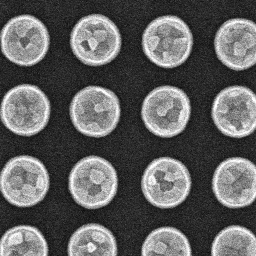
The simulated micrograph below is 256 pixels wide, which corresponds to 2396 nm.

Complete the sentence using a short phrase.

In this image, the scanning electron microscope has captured a regular array of raised bodies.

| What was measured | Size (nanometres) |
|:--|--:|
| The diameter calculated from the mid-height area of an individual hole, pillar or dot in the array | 451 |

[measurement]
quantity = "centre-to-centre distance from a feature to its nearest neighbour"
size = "653 nanometres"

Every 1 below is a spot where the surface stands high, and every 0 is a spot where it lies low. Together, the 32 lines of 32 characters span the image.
00000000000000000000000000000000
00000000000000000000000000000000
00111000001110000000110000000000
01111100011111000001111000001111
11111100011111100011111100011111
11111100011111100011111100011111
01111100011111100011111100011111
01111000001111000001111000001111
00000000000000000000000000000110
00000000000000000000000000000000
00000000000000000000000000000000
01111000001111000001111000001110
01111100011111100011111000011111
11111100011111100011111100011111
11111100011111100011111100011111
01111100011111000011111000011111
00110000001110000001110000001110
00000000000000000000000000000000
00000000000000000000000000000000
00000000000000000000000000000000
01111000001111000001111000001110
11111100011111000011111000011111
11111100011111000011111100011111
11111100011111000011111100011111
01111000011111000011111000011111
00110000001110000001110000001110
00000000000000000000000000000000
00000000000000000000000000000000
00110000001110000000000000000100
01111000011111000001111000011111
11111100011111000011111100011111
11111100011111000011111100011111